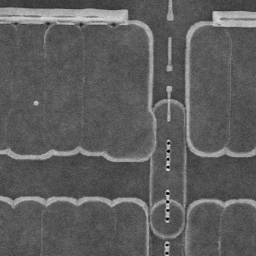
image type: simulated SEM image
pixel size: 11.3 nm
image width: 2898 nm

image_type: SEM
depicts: wiring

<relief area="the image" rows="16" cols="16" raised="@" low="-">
----------------
@@@@@@@@@----@@@
@@@@@@@@@---@@@@
@@@@@@@@@---@@@@
@@@@@@@@@---@@@@
@@@@@@@@@---@@@@
@@@@@@@@@---@@@@
@@@@@@@@@@--@@@@
@@@@@@@@@@--@@@@
@@@@@@@@@---@@@@
----------------
----------------
-@-@-@----------
@@@@@@@@@@@@@@@@
@@@@@@@@@@@@@@@@
@@@@@@@@@---@@@@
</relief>